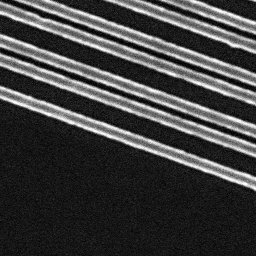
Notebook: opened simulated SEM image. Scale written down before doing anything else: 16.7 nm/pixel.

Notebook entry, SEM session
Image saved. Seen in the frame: parallel lines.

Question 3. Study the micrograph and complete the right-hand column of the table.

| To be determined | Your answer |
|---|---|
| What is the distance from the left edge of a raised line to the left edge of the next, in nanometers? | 417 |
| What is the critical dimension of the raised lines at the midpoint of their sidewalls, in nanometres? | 171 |